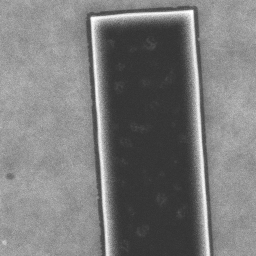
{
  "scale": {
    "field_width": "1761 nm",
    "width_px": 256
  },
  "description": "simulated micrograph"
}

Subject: one or a few lines or trenches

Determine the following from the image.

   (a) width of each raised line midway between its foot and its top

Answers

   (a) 697 nm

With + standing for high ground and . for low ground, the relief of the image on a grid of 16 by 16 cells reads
................
......++++++....
......++++++....
......++++++....
......++++++....
......++++++....
......++++++....
......++++++....
......+++++++...
......+++++++...
......+++++++...
......+++++++...
......+++++++...
.......++++++...
.......++++++...
.......++++++...